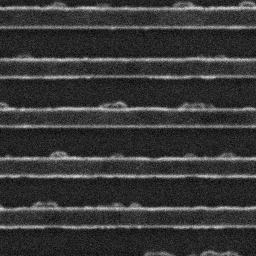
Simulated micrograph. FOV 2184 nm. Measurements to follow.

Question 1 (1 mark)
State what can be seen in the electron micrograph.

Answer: lines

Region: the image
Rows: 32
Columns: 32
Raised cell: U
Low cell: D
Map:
DDDDDDDDDDDDDDDDDDDDDDDDDDDDDDDD
UUUUUUUUUUUUUUUUUUUUUUUUUUUUUUUU
UUUUUUUUUUUUUUUUUUUUUUUUUUUUUUUU
DDDDDDDDDDDDDDDDDDDDDDDDDDDDDDDD
DDDDDDDDDDDDDDDDDDDDDDDDDDDDDDDD
DDDDDDDDDDDDDDDDDDDDDDDDDDDDDDDD
DDDDDDDDDDDDDDDDDDDDDDDDDDDDDDDD
UUUUUUUUUUUUUUUUUUUUUUUUUUUUUUUU
UUUUUUUUUUUUUUUUUUUUUUUUUUUUUUUU
UUUUUUUUUUUUUUUUUUUUUUUUUUUUUUUU
DDDDDDDDDDDDDDDDDDDDDDDDDDDDDDDD
DDDDDDDDDDDDDDDDDDDDDDDDDDDDDDDD
DDDDDDDDDDDDDDDDDDDDDDDDDDDDDDDD
DDDDDDDDDDDDDDDDDDDDDDDDDDDDDDDD
UUUUUUUUUUUUUUUUUUUUUUUUUUUUUUUU
UUUUUUUUUUUUUUUUUUUUUUUUUUUUUUUU
DDDDDDDDDDDDDDDDDDDDDDDDDDDDDDDD
DDDDDDDDDDDDDDDDDDDDDDDDDDDDDDDD
DDDDDDDDDDDDDDDDDDDDDDDDDDDDDDDD
DDDDDDDDDDDDDDDDDDDDDDDDDDDDDDDD
UUUUUUUUUUUUUUUUUUUUUUUUUUUUUUUU
UUUUUUUUUUUUUUUUUUUUUUUUUUUUUUUU
DDDDDDDDDDDDDDDDDDDDDDDDDDDDDDDD
DDDDDDDDDDDDDDDDDDDDDDDDDDDDDDDD
DDDDDDDDDDDDDDDDDDDDDDDDDDDDDDDD
DDDDDDDDDDDDDDDDDDDDDDDDDDDDDDDD
UUUUUUUUUUUUUUUUUUUUUUUUUUUUUUUU
UUUUUUUUUUUUUUUUUUUUUUUUUUUUUUUU
DDDDDDDDDDDDDDDDDDDDDDDDDDDDDDDD
DDDDDDDDDDDDDDDDDDDDDDDDDDDDDDDD
DDDDDDDDDDDDDDDDDDDDDDDDDDDDDDDD
DDDDDDDDDDDDDDDDDDDDDDDDDDDDDDDD